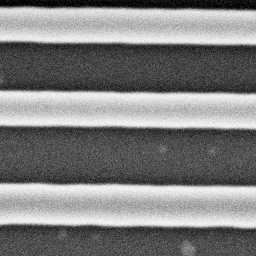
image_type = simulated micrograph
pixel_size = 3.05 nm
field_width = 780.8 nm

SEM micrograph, groups of lines, slits or small figures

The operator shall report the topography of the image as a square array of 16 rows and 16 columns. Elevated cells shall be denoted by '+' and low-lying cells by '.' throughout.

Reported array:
................
++++++++++++++++
++++++++++++++++
................
................
................
++++++++++++++++
++++++++++++++++
................
................
................
................
++++++++++++++++
++++++++++++++++
................
................